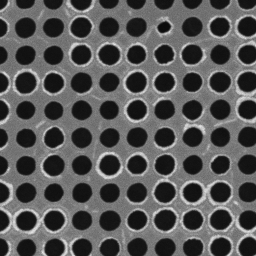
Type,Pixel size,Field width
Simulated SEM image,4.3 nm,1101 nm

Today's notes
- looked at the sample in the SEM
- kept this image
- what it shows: a regular array of holes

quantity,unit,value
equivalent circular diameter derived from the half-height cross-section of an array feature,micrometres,0.0869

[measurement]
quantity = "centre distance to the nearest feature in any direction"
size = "117 nanometres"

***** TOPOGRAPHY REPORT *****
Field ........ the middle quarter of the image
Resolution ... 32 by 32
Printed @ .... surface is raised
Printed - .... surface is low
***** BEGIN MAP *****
@@@@@@@@@@@@@@@@@@@@@@@@@@@@@@@@
@@@@@@@@@@@@@@@@@@@@@@@@@@@@@@@@
@@@---@@@@---@@@@---@@@@---@@@@-
@@-----@@-----@@-----@@----@@@--
@@-----@@-----@@-----@@-----@@--
@@-----@@-----@@-----@@----@@@--
@@----@@@@---@@@----@@@----@@@--
@@@@@@@@@@@@@@@@@@@@@@@@@@@@@@@@
@@@@@@@@@@@@@@@@@@@@@@@@@@@@@@@@
@@@---@@@@---@@@@---@@@@---@@@@-
@@-----@@----@@@-----@@----@@@--
@@-----@@-----@@-----@------@---
@@-----@@----@@@-----@@-----@@--
@@@---@@@@---@@@@---@@@----@@@@-
@@@@@@@@@@@@@@@@@@@@@@@@@@@@@@@@
@@@@@@@@@@@@@@@@@@@@@@@@@@@@@@@@
@@@---@@@@---@@@@---@@@----@@@@-
@@-----@@-----@@-----@@-----@@--
@@-----@@-----@@-----@------@@--
@@-----@@-----@@-----@@----@@@--
@@@---@@@@---@@@@--@@@@@--@@@@@-
@@@@@@@@@@@@@@@@@@@@@@@@@@@@@@@@
@@@@@@@@@@@@@@@@@@@@@@@@@@@@@@@@
@@@---@@@@---@@@@---@@@----@@@@-
@@-----@@-----@@-----@@-----@@--
@@-----@@-----@@-----@@-----@@--
@@-----@@-----@@----@@@----@@@--
@@@---@@@@---@@@@@-@@@@@---@@@@-
@@@@@@@@@@@@@@@@@@@@@@@@@@@@@@@@
@@@@@@@@@@@@@@@@@@@@@@@@@@@@@@@@
@@@---@@@@---@@@@---@@@----@@@--
@@-----@@-----@@-----@@-----@@--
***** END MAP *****